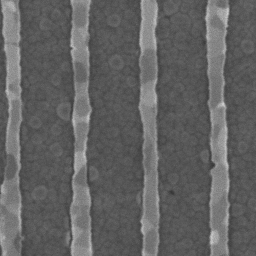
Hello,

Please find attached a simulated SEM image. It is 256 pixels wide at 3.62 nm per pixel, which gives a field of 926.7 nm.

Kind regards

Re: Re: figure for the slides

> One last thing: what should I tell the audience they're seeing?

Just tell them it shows one or a few lines or trenches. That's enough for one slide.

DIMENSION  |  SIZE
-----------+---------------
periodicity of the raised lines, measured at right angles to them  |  248 nm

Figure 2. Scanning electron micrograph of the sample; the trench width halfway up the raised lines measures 192 nm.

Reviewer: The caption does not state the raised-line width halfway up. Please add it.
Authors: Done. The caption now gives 54.8 nm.